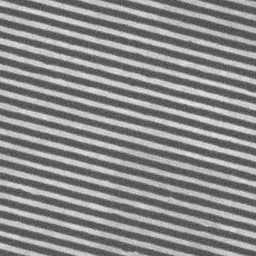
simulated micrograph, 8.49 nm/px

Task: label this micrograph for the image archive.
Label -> parallel lines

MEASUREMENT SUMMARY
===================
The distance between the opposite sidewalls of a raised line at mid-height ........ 38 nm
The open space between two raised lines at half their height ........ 69.8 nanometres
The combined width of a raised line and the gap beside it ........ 105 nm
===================